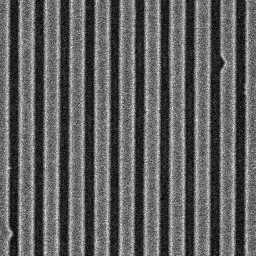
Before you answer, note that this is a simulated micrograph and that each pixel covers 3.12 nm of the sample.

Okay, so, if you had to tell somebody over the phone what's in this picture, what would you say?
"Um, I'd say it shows parallel lines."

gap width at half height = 32.6 nanometres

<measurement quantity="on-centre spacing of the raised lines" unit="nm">78.7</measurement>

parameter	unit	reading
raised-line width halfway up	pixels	14.6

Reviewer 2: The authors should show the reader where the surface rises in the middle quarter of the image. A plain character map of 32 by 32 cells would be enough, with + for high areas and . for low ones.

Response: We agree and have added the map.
..+++...+++...++++...+++...+++..
..+++...+++...+++....+++...+++..
..+++...+++...+++....+++...+++..
..+++...+++...+++....+++...+++..
..+++...+++...+++....+++...+++..
..+++...+++...+++....+++...+++..
..+++...+++...+++....+++...+++..
..+++...+++...+++....+++...+++..
..+++...+++...+++....+++...+++..
..+++...+++...+++...++++...+++..
..+++...+++...+++...++++...+++..
..+++...+++...+++...++++...+++..
.++++...+++...+++...++++...+++..
.++++...+++...+++...++++...+++..
.++++...+++...+++...++++...+++..
.++++...+++...+++...++++...+++..
.++++...+++...+++...++++...+++..
.++++...+++...+++...++++...+++..
.++++...+++...+++...++++...+++..
.++++...+++...+++...++++...+++..
.++++...+++...+++...++++...+++..
.++++...+++...+++...++++...+++..
.++++...+++...+++...++++...+++..
.++++...+++...+++...++++...+++..
.++++...+++...+++...++++...+++..
.++++...+++...+++...++++...+++..
.++++...+++...+++...++++...+++..
.++++...+++...+++...++++...+++..
.++++...+++...+++...++++...+++..
.++++...+++...+++...++++...+++..
.++++...+++...+++...++++...+++..
.++++...+++...+++...++++...+++..